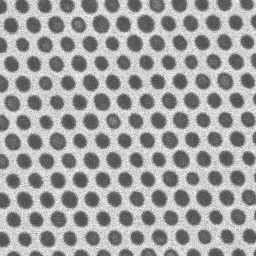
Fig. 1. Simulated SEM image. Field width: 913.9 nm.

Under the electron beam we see a regular array of holes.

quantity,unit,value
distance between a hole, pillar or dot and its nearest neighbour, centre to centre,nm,79.6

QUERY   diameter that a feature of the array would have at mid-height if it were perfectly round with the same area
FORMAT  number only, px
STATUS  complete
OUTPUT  15.5